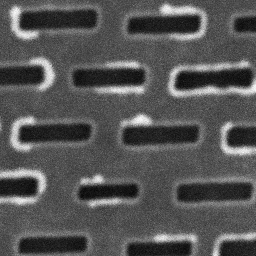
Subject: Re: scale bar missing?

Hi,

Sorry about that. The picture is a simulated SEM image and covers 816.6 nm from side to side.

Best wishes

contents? a regular array of holes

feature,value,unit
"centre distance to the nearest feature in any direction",245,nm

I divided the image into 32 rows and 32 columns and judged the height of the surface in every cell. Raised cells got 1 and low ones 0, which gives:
11111111111111111111111111111111
11100000000011111111111111111111
11000000000011110000000001111000
11100000000011110000000001111000
11111111111111111111111111111111
11111111111111111111111111111111
11111111111111111111111111111111
11111111111111111111111111111111
00000111111111000011111111111101
00000011100000000011110000000000
00000111100000000011110000000000
11111111111111111111111111111111
11111111111111111111111111111111
11111111111111111111111111111111
11111111111111111111111111111111
11111000000111111111111111111111
11000000000111100000000001110000
11000000000111100000000001110000
11111111111111111111111111111111
11111111111111111111111111111111
11111111111111111111111111111111
11111111111111111111111111111111
00000111111111111111111111111111
00000111110000000111110000000000
00001111110000000111110000000000
11111111111111111111111111111111
11111111111111111111111111111111
11111111111111111111111111111111
11111111111111111111111111111111
11111111001111111111111111111111
11000000000111110000000011110000
11000000000111110000000011100000